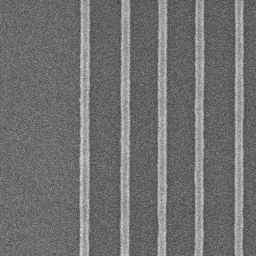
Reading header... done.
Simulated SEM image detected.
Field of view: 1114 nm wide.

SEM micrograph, parallel lines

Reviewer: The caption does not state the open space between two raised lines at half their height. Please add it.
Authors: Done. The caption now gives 30.9 px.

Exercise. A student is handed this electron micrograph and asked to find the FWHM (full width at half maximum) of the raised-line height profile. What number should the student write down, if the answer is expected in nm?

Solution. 33.7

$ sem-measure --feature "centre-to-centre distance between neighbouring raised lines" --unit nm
168